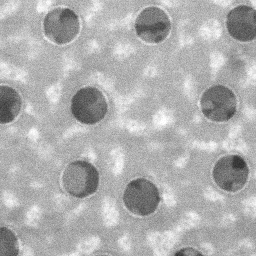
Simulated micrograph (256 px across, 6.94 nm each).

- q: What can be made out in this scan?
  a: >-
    raised bodies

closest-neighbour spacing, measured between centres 490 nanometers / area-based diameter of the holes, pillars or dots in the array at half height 274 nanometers